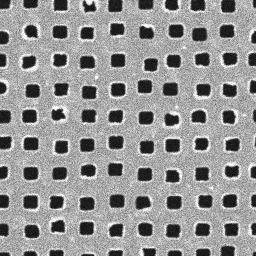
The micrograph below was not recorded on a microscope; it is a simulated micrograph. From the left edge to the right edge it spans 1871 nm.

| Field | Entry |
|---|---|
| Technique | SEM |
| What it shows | a regular array of holes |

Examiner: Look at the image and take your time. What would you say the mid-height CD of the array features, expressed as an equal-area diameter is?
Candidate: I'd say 108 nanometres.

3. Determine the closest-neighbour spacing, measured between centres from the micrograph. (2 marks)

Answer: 191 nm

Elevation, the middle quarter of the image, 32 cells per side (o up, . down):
oooo....oooo...ooooo...ooo...ooo
oooooooooooooooooooo...ooooooooo
oooooooooooooooooooooooooooooooo
oooooooooooooooooooooooooooooooo
oooooooooooooooooo....oooooooooo
.oooo..ooooo...ooo....ooo...oooo
.ooo....oooo....oo....ooo...oooo
.ooo....oooo...oooooooooo...oooo
ooooo...oooooooooooooooooooooooo
oooooooooooooooooooooooooooooooo
oooooooooooooooooooooooooooooooo
ooooo..ooooooooooooooooooooooooo
oooo....ooo....oooo...oooooooooo
oooo....ooo....oooo...ooo....ooo
ooooo...ooo...ooooo...ooo....ooo
oooooooooooooooooooooooooo.ooooo
oooooooooooooooooooooooooooooooo
oooooooooooooooooooooooooooooooo
ooooo..oooo....ooooooooooooooooo
.ooo....ooo....oooo...ooo....ooo
.ooo....ooo....oooo....oo....ooo
.ooo....ooooooooooo....oo....ooo
oooooooooooooooooooo..oooooooooo
oooooooooooooooooooooooooooooooo
oooooooooooooooooooooooooooooooo
ooooo...ooo....ooooooooooooooooo
.ooo....ooo....oooo...oooo..oooo
.ooo....ooo...oooo....ooo....ooo
oooooooooooooooooo....ooo....ooo
oooooooooooooooooooooooooo..oooo
oooooooooooooooooooooooooooooooo
oooooooooooooooooooooooooooooooo